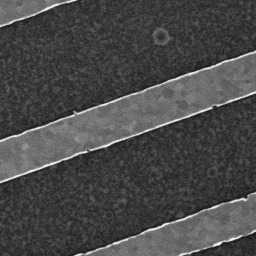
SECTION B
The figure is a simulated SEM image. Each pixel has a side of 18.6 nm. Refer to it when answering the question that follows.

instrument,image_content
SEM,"one or a few lines or trenches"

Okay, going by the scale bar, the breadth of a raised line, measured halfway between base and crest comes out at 39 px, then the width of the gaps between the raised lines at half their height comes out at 1770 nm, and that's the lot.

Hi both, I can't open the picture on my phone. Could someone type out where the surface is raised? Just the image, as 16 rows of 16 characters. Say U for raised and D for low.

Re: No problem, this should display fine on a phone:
UUUDDDDDDDDDDDDD
DDDDDDDDDDDDDDDD
DDDDDDDDDDDDDDDD
DDDDDDDDDDDDDDDU
DDDDDDDDDDDDUUUU
DDDDDDDDDUUUUUUU
DDDDDDDUUUUUUUDD
DDDDUUUUUUUDDDDD
DUUUUUUUDDDDDDDD
UUUUUDDDDDDDDDDD
UUUDDDDDDDDDDDDD
DDDDDDDDDDDDDDDD
DDDDDDDDDDDDDDDU
DDDDDDDDDDDDUUUU
DDDDDDDDDUUUUUUU
DDDDDDUUUUUUUDDD